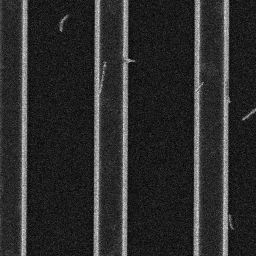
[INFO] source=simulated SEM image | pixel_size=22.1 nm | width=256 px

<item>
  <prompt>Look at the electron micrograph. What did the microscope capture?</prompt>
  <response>one or a few lines or trenches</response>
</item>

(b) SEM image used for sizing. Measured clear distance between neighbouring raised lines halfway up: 1590 nanometres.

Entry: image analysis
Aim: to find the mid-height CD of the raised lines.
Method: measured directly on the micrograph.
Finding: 653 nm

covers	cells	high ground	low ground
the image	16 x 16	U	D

UUDDDDUUDDDDUUDD
UUDDDDUUDDDDUUDD
UUDDDDUUDDDDUUDD
UUDDDDUUDDDDUUDD
UUDDDDUUDDDDUUDD
UUDDDDUUDDDDUUDD
UDDDDDUUDDDDUUDD
UDDDDDUUDDDDUUDD
UDDDDDUUDDDDUUDD
UDDDDDUUDDDDUUDD
UDDDDDUUDDDDUUDD
UDDDDDUUDDDDUUDD
UDDDDDUUDDDDUUDD
UDDDDDUUDDDDUUDD
UDDDDDUUDDDDUUDD
UDDDDDUUDDDDUUDD